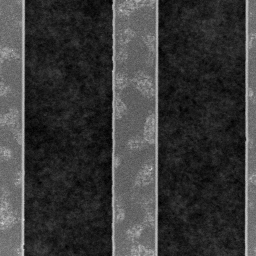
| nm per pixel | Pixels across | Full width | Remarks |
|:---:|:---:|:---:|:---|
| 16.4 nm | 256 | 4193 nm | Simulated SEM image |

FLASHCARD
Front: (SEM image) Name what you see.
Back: one or a few lines or trenches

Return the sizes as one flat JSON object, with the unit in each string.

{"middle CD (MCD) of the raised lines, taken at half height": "712 nm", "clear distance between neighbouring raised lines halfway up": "90 px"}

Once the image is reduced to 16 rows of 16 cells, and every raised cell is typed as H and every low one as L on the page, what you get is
HLLLLLLHHHLLLLLH
HLLLLLLHHHLLLLLH
HLLLLLLHHHLLLLLH
HLLLLLLHHHLLLLLH
HLLLLLLHHHLLLLLH
HLLLLLLHHHLLLLLH
HLLLLLLHHHLLLLLH
HLLLLLLHHHLLLLLH
HLLLLLLHHHLLLLLH
HLLLLLLHHHLLLLLH
HLLLLLLHHHLLLLLH
HLLLLLLHHHLLLLLH
HLLLLLLHHHLLLLLH
HLLLLLLHHHLLLLLH
HLLLLLLHHHLLLLLH
HLLLLLLHHHLLLLLH